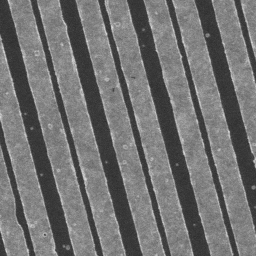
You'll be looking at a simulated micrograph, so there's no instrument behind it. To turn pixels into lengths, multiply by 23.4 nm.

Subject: parallel lines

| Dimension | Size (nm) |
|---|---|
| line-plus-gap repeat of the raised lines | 766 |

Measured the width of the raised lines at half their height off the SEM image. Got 496 nm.